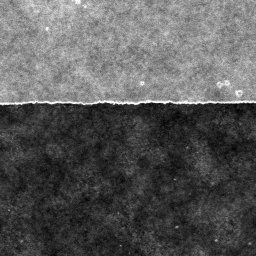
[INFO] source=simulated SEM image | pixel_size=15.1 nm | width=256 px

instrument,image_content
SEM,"one or a few lines or trenches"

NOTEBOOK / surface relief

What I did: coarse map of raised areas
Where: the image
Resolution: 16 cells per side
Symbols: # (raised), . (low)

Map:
################
################
################
################
################
################
#...............
................
................
................
................
................
................
................
................
................